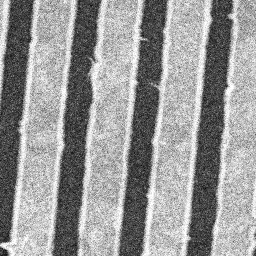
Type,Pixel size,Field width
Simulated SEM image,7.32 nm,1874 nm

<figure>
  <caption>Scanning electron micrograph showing one or a few lines or trenches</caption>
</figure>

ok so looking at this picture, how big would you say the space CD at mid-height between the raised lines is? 221 nm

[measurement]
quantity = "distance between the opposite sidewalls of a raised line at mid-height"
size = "267 nanometres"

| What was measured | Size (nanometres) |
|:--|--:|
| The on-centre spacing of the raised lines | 489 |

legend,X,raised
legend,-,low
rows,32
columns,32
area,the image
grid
X----XXXX----XXXX----XXXXX---XXX
X---XXXXX----XXXX----XXXXX---XXX
X---XXXXX----XXXX----XXXXX---XXX
X---XXXXX----XXXX----XXXXX---XXX
----XXXXX----XXXX----XXXXX---XXX
----XXXXX---XXXXX----XXXX----XXX
----XXXX----XXXXX----XXXX----XXX
----XXXX----XXXXX----XXXX----XXX
----XXXX----XXXXX----XXXX----XXX
----XXXX----XXXXX----XXXX----XXX
----XXXX----XXXXX---XXXXX----XXX
----XXXX----XXXX----XXXXX----XXX
---XXXXX----XXXX----XXXXX---XXXX
---XXXXX----XXXX----XXXXX---XXXX
---XXXXX----XXXX----XXXX----XXXX
---XXXX-----XXXX----XXXX----XXXX
---XXXX----XXXXX----XXXX----XXXX
---XXXXX---XXXXX---XXXXX----XXXX
---XXXXX---XXXXX----XXXX----XXXX
---XXXX----XXXXX----XXXX----XXXX
---XXXX----XXXXX---XXXXX----XXXX
---XXXX----XXXXX---XXXXX----XXXX
---XXXX----XXXX----XXXXX----XXXX
--XXXXX----XXXX----XXXXX----XXXX
--XXXXX----XXXX----XXXXX----XXXX
--XXXXX----XXXX----XXXXX---XXXXX
--XXXXX---XXXXX----XXXX----XXXXX
--XXXXX---XXXXX----XXXX----XXXXX
--XXXX----XXXXX----XXXX----XXXXX
--XXXX----XXXXX---XXXXX----XXXX-
-XXXXX----XXXXX---XXXXX----XXXXX
-XXXXX----XXXX----XXXXX----XXXX-